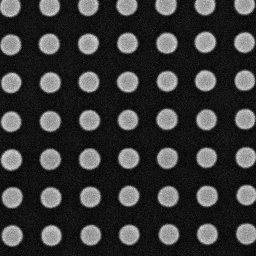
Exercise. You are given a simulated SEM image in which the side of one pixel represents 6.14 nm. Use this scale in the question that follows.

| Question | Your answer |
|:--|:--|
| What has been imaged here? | a regular array of raised bodies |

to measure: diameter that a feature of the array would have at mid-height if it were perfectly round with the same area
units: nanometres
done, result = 121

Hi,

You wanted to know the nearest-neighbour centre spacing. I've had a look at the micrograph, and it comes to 0.233 microns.